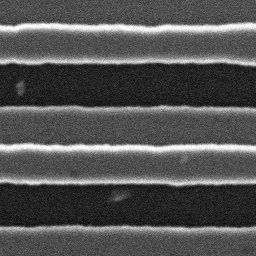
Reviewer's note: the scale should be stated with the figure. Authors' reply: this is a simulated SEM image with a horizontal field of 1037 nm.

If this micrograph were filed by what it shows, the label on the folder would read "lines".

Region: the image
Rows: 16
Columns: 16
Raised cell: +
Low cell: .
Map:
++++++++++++++++
++++++++++++++++
++++++++++++++++
++++++++++++++++
................
................
................
++++++++++++++++
++++++++++++++++
++++++++++++++++
++++++++++++++++
...........+....
................
................
++++++++++++++++
++++++++++++++++